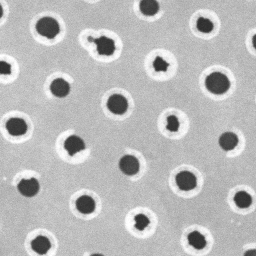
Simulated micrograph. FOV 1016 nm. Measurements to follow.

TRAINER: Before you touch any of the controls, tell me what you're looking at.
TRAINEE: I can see a regular array of holes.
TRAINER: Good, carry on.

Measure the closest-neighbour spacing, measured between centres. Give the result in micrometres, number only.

0.232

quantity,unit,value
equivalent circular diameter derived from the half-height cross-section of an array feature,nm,81.1